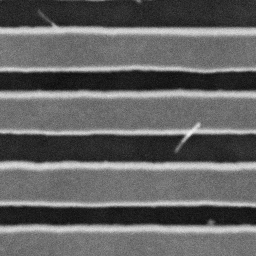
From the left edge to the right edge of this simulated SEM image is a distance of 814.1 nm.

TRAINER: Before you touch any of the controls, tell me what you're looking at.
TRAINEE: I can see lines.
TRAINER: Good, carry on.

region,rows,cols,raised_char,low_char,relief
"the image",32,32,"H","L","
LLLLLLLLLLLLLLLLLLLLLLLLLLLLLLLL
LLLLLLLLLLLLLLLLLLLLLLLLLLLLLLLL
LLLLLLLLLLLLLLLLLLLLLLLLLLLLLLLL
LLLLLLHHLLLLLLLLLLLLLLLLLLLLLLLL
HHHHHHHHHHHHHHHHHHHHHHHHHHHHHHHH
HHHHHHHHHHHHHHHHHHHHHHHHHHHHHHHH
HHHHHHHHHHHHHHHHHHHHHHHHHHHHHHHH
HHHHHHHHHHHHHHHHHHHHHHHHHHHHHHHH
HHHHHHHHHHHHHHHHHHHHHHHHHHHHHHHH
LLLLLLLLLLLLLLLLLLLLLLLLLLLLLLLL
LLLLLLLLLLLLLLLLLLLLLLLLLLLLLLLL
LLLLLLLLLHHLLLLLLLLHHHHHHHLLLLLL
HHHHHHHHHHHHHHHHHHHHHHHHHHHHHHHH
HHHHHHHHHHHHHHHHHHHHHHHHHHHHHHHH
HHHHHHHHHHHHHHHHHHHHHHHHHHHHHHHH
HHHHHHHHHHHHHHHHHHHHHHHHHHHHHHHH
HHHHHHHHHHHHHHHHHHHHHHHHHHHHHHHH
LLLLLLLLLLLLLLLLLLLLLLLLLLLLLLLL
LLLLLLLLLLLLLLLLLLLLLLLLLLLLLLLL
LLLLLLLLLLLLLLLLLLLLLLLLLLLLLLLL
HHHHHHHHHHHHHHHHHHHLHHHHHHHLLHHH
HHHHHHHHHHHHHHHHHHHHHHHHHHHHHHHH
HHHHHHHHHHHHHHHHHHHHHHHHHHHHHHHH
HHHHHHHHHHHHHHHHHHHHHHHHHHHHHHHH
HHHHHHHHHHHHHHHHHHHHHHHHHHHHHHHH
HHHHHHHHHHHHHHHHHHHHHHHHHHHHHHHH
LLLLLLLLLLLLLLLLLLLLLLLLLLLLLLLL
LLLLLLLLLLLLLLLLLLLLLLLLLLLLLLLL
HHHHHHHHHHHHHHHHHHHHHHHHHHHHHHHH
HHHHHHHHHHHHHHHHHHHHHHHHHHHHHHHH
HHHHHHHHHHHHHHHHHHHHHHHHHHHHHHHH
HHHHHHHHHHHHHHHHHHHHHHHHHHHHHHHH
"